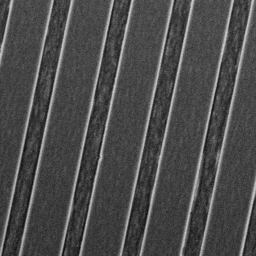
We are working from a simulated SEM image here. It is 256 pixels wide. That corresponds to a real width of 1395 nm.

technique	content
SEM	parallel lines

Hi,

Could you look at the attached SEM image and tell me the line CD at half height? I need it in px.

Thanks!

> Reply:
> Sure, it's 41.2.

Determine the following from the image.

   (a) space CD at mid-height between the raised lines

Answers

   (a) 98.1 nm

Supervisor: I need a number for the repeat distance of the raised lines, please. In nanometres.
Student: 321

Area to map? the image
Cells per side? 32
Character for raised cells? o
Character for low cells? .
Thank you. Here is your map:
.oooooo..ooooo..oooooo..ooooo..o
.ooooo...ooooo..ooooo...ooooo..o
.ooooo..oooooo..ooooo..oooooo..o
.ooooo..ooooo...ooooo..oooooo..o
oooooo..ooooo..oooooo..ooooo...o
oooooo..ooooo..oooooo..ooooo..oo
ooooo...ooooo..ooooo...ooooo..oo
ooooo..oooooo..ooooo..oooooo..oo
ooooo..ooooo...ooooo..ooooo...oo
ooooo..ooooo..oooooo..ooooo...oo
ooooo..ooooo..oooooo..ooooo..ooo
oooo...ooooo..ooooo...ooooo..ooo
oooo..oooooo..ooooo..oooooo..ooo
oooo..ooooo...ooooo..ooooo...ooo
oooo..ooooo..oooooo..ooooo...ooo
ooo...ooooo..ooooo...ooooo..oooo
ooo...ooooo..ooooo...ooooo..oooo
ooo..oooooo..ooooo..oooooo..oooo
ooo..ooooo...ooooo..ooooo...oooo
ooo..ooooo..oooooo..ooooo..ooooo
oo...ooooo..ooooo...ooooo..ooooo
oo...ooooo..ooooo...ooooo..ooooo
oo..oooooo..ooooo..oooooo..ooooo
oo..ooooo...ooooo..ooooo...ooooo
oo..ooooo..oooooo..ooooo...ooooo
o...ooooo..ooooo...ooooo..oooooo
o...ooooo..ooooo...ooooo..ooooo.
o..oooooo..ooooo..oooooo..ooooo.
o..ooooo...ooooo..ooooo...ooooo.
o..ooooo..oooooo..ooooo..oooooo.
...ooooo..ooooo...ooooo..oooooo.
...ooooo..ooooo...ooooo..ooooo..